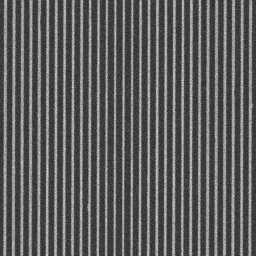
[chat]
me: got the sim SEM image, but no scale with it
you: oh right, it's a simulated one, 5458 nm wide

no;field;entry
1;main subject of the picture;parallel lines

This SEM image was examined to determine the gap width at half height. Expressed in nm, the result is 128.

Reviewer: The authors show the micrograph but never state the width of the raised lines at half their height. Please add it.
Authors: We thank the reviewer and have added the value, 53.3 nm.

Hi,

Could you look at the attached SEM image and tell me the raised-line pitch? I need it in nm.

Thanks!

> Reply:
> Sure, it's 180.